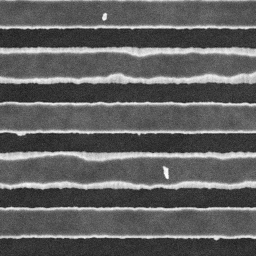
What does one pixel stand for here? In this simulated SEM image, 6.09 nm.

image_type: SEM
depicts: lines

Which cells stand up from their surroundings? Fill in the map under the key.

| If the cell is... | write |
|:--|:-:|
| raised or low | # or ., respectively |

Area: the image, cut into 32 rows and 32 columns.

################################
################################
################################
.#....................#......#..
................................
................................
################################
################################
################################
################################
................................
................................
................................
################################
################################
################################
.###############################
................................
................................
.##########..###################
################################
################################
################################
................................
................................
................................
################################
################################
################################
################################
................................
................................